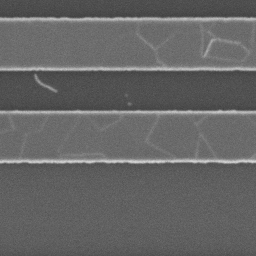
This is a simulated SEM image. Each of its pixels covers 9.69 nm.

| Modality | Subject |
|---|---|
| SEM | lines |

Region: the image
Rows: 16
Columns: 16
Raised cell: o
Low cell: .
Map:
................
oooooooooooooooo
oooooooooooooooo
oooooooooooooooo
................
................
................
oooooooooooooooo
oooooooooooooooo
oooooooooooooooo
................
................
................
................
................
................